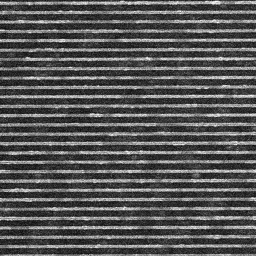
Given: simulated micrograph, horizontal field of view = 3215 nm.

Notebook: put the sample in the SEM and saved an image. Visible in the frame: parallel lines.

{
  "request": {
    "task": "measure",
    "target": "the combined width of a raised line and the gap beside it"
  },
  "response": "118 nanometers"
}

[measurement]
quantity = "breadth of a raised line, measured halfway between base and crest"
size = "31.4 nanometers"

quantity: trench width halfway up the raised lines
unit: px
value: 7